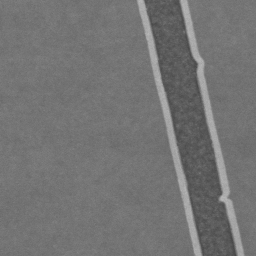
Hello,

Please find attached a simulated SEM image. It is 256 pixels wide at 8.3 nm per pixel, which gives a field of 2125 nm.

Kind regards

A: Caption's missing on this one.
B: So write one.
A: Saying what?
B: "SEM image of one or a few lines or trenches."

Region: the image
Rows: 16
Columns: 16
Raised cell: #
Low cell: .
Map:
#########...####
#########...####
#########...####
##########..####
##########...###
##########...###
##########...###
###########..###
###########..###
###########...##
###########...##
###########...##
############..##
############..##
############...#
############...#